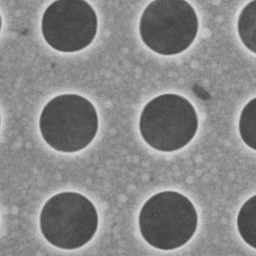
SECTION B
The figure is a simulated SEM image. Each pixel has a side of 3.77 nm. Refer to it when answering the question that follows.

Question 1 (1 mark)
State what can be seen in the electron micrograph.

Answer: holes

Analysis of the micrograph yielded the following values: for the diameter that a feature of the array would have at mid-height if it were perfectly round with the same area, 218 nm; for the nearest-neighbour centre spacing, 368 nm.